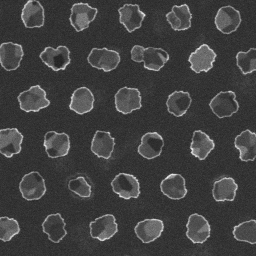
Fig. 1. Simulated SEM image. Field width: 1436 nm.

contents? a regular array of raised bodies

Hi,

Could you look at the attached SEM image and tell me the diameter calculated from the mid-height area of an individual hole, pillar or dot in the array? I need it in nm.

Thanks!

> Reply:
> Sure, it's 143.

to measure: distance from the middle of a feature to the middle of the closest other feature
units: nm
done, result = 261